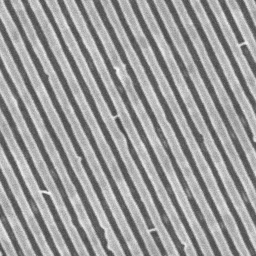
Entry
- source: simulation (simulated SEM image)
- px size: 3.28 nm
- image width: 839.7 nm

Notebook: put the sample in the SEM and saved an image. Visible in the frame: parallel lines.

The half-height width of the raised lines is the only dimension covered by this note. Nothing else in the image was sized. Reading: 27.7 nm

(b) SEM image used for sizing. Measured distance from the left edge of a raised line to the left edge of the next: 53 nm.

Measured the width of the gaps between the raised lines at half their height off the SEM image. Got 24.8 nm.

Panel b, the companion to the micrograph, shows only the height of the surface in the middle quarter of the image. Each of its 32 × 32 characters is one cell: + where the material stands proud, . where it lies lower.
+...++..++..+++..++..+++..++...+
++..++...++..++...++..++..+++..+
++...++..++..+++..++..+++..++..+
.++..++...++..++..+++..++..+++..
.++...++..++...++..++..+++..++..
.+++..++...++..++..+++..++..+++.
..++...++..++..+++..++..+++..++.
..+++..++..++...++..+++..++..+++
+..++...++..++..+++..++..+++..++
+..+++..++..+++..++..+++..++..++
++..++..+++..++..+++..++..+++..+
++..+++..++..+++..++..+++..++..+
+++..++..+++.+++..+++..++..++..+
.++..++...+++.++...++..++...++..
..++..++..+++.+++..+++..++..++..
..++..++...++..++...++..++...++.
..++...++..+++.+++..+++..++..++.
...++..++...++..++...++..++...++
+..+++..++..+++..++..++...++..++
+...++..++...+++.++...++..++...+
++..+++..++..+++..++..++...++..+
++...++..+++..++..++...++..++...
.++..+++..++..++..+++..+++.+++..
.+++..++..+++.+++..++...++..++..
..++..+++..++..++..+++..+++.+++.
..++...++..++...++..++...++..++.
...++..++..+++..++...++..++..+++
+..++...++..++..+++..++...++..++
+...++..++..+++..++...++..++..++
++..++..+++..++..+++..++...++..+
++...++..++..+++..++...++..++..+
.++..++..+++..++..+++..++..+++..